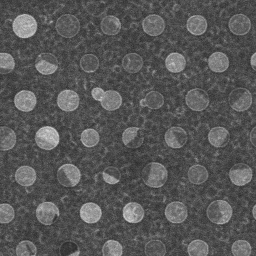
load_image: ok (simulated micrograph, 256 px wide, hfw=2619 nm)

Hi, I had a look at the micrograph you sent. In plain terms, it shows a regular array of raised bodies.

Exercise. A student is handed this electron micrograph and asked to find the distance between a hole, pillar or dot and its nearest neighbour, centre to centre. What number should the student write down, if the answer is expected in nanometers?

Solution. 438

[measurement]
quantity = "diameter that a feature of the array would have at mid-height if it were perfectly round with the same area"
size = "218 nanometres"